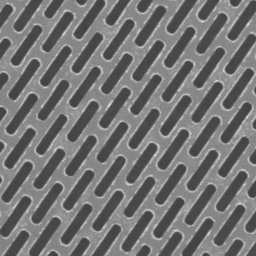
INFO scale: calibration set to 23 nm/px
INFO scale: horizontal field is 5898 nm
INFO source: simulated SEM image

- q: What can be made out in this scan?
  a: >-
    a regular array of holes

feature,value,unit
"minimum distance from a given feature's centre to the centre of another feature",783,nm